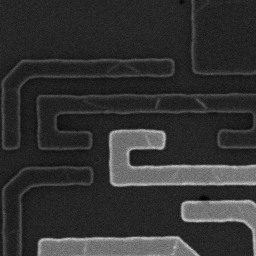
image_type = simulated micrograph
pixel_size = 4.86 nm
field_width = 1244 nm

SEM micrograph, wiring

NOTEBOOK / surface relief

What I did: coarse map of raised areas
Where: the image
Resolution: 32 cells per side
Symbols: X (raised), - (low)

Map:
------------------------XXXXXXXX
------------------------XXXXXXXX
------------------------XXXXXXXX
------------------------XXXXXXXX
------------------------XXXXXXXX
------------------------XXXXXXXX
------------------------XXXXXXXX
------------------XXX---XXXXXXXX
--XXXXXXXXXXXXXXXXXXXX--XXXXXXXX
-XXXXXXXXXXXXXXX---XX-----------
XXX-----------------------------
XX------------------------------
XX---XXXXXXXXXXXXXXXXXXXXXXXXXXX
XX---XXXXXXXXXXXXXXXXXXXXXXXXXXX
XX---XX-------------------------
XX---XX-------------------------
XX---XXX------XXXXXX--------XXXX
XX---XXXXXX---XXXXXXX------XXXXX
-X---XXXXXX---XXXXXX------------
--------------XX----------------
--------------XX----------------
--XXXXXXXXXX--XXXXXXXXXXXXXXXXXX
-XXXXXXXXXXX--XXXXXXXXXXXXXXXXXX
XXXX----------------------------
XXX-----------------------------
XXX--------------------XXXXXXXXX
XXX--------------------XXXXXXXXX
XXX--------------------XXXXXXXXX
XXX----------------------------X
XXX-----------------------------
XXX--XXXXXXXXXXXXXXXXXX---------
XXX--XXXXXXXXXXXXXXXXXXX--------